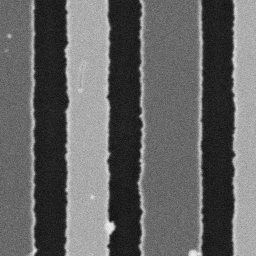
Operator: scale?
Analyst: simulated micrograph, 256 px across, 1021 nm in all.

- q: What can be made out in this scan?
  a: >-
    lines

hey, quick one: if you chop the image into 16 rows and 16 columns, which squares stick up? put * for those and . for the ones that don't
**..***..****..*
**..***..****..*
**..***..****..*
**..***..****..*
**..***..****..*
**..***..****..*
**..***..****..*
**..***..****..*
**..***..****..*
**..***..****..*
**..***..****..*
**..***..****..*
**..***..****..*
**..***..****..*
**..***..****..*
**..***..****..*